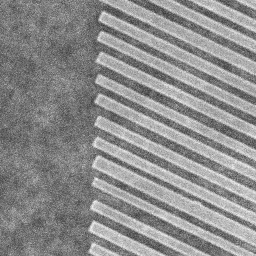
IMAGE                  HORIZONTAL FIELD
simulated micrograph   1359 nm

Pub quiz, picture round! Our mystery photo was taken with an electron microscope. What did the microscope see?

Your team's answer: parallel lines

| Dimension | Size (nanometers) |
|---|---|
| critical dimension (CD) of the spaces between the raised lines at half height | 52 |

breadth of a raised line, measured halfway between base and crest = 8.89 pixels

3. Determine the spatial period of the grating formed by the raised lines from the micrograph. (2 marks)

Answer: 102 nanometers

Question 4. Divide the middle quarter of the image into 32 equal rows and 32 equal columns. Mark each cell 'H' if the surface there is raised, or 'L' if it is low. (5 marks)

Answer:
LLLLLLLLLLLHHHHHLLLLLLHHHHHLLLLL
LLLLLLLLLLLLLHHHHHLLLLLLHHHHHLLL
LLLLLLLLLLLLLLLHHHHHLLLLLLHHHHHL
LLLLLLLLLHHLLLLLLHHHHHLLLLLLHHHH
LLLLLLLLHHHHHLLLLLLHHHHHLLLLLLHH
LLLLLLLLLLHHHHHLLLLLLHHHHHLLLLLL
LLLLLLLLLLLLHHHHHLLLLLLHHHHHLLLL
LLLLLLLLLLLLLLHHHHHLLLLLLHHHHHHL
LLLLLLLLHHHLLLLLHHHHLLLLLLLHHHHH
LLLLLLLLHHHHHLLLLLHHHHHLLLLLLHHH
LLLLLLLLLLHHHHHLLLLLHHHHHLLLLLLH
LLLLLLLLLLLLHHHHHLLLLLHHHHHLLLLL
LLLLLLLLLLLLLLHHHHHLLLLLHHHHHLLL
LLLLLLLLLHLLLLLLHHHHHLLLLLHHHHHL
LLLLLLLLHHHHLLLLLLHHHHHLLLLLHHHH
LLLLLLLLLHHHHLLLLLLLHHHHHLLLLLHH
LLLLLLLLLLLHHHHLLLLLLLHHHHHLLLLL
LLLLLLLLLLLLLHHHHHLLLLLLHHHHHLLL
LLLLLLLLLLLLLLLHHHHHLLLLLLHHHHHL
LLLLLLLLHHLLLLLLLHHHHHLLLLLLLHHH
LLLLLLLLHHHHHLLLLLLHHHHHLLLLLLLH
LLLLLLLLLLHHHHHLLLLLLHHHHHLLLLLL
LLLLLLLLLLLLHHHHHLLLLLLHHHHHLLLL
LLLLLLLLHLLLLLHHHHHLLLLLLHHHHHLL
LLLLLLLLHHHLLLLLHHHHHLLLLLLHHHHH
LLLLLLLHHHHHHLLLLLHHHHHLLLLLLHHH
LLLLLLLLLHHHHHHLLLLLHHHHHLLLLLLH
LLLLLLLLLLLHHHHHHHLLLLHHHHHLLLLL
LLLLLLLLLLLLLHHHHHHHLLLLHHHHHLLL
LLLLLLLLHHLLLLLHHHHHHHLLLLHHHHHL
LLLLLLLLHHHHLLLLLHHHHHHHLLLLHHHH
LLLLLLLLLLHHHHLLLLLHHHHHHHLLLLHH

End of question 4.